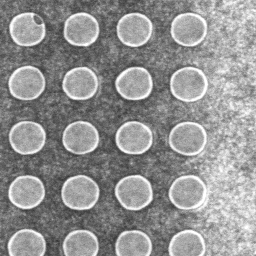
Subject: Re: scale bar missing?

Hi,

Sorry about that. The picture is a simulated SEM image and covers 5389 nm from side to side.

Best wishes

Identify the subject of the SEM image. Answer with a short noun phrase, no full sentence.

a regular array of raised bodies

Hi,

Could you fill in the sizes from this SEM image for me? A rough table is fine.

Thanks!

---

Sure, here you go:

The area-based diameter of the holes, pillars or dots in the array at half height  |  718 nm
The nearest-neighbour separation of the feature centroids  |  1120 nm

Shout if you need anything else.